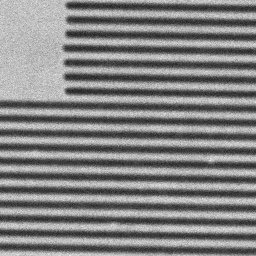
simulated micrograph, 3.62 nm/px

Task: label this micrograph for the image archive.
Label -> parallel lines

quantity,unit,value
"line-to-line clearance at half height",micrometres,0.0245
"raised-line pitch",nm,51.7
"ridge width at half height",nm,28.1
